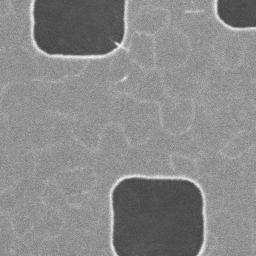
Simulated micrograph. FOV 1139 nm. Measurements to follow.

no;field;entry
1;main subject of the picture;holes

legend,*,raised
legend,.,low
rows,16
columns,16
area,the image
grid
**......******..
**......******..
**......********
****..**********
****************
****************
****************
****************
****************
****************
****************
*******.....****
*******......***
*******......***
*******......***
*******......***